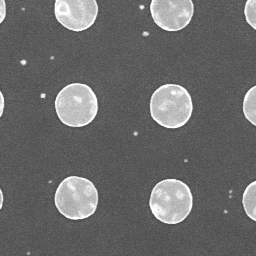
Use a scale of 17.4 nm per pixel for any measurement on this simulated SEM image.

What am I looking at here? raised bodies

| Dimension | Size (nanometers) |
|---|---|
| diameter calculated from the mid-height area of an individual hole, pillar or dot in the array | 736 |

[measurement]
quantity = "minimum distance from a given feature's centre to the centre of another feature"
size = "1640 nm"